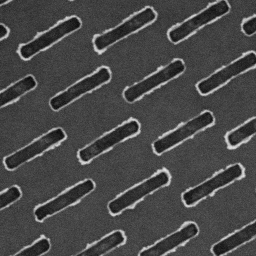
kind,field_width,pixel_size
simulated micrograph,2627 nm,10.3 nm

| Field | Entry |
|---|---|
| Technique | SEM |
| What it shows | a regular array of holes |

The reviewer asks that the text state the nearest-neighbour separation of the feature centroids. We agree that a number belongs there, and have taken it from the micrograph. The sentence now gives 59.4 pixels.